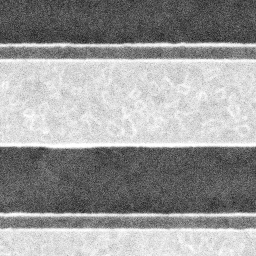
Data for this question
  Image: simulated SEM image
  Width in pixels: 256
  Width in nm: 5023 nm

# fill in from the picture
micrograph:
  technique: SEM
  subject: lines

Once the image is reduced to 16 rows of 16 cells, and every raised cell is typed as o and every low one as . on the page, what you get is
................
................
................
oooooooooooooooo
oooooooooooooooo
oooooooooooooooo
oooooooooooooooo
oooooooooooooooo
oooooooooooooooo
................
................
................
................
oooooooooooooooo
oooooooooooooooo
oooooooooooooooo